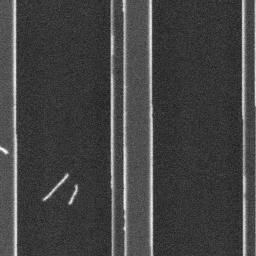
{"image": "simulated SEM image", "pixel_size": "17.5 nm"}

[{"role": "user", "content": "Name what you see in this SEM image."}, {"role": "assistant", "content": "lines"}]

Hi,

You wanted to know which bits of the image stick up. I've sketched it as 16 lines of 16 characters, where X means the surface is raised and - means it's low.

X------XX------X
X------XX------X
X------XX------X
X------XX------X
X------XX------X
X------XX------X
X------XX------X
X------XX------X
X------XX------X
X------XX------X
X------XX------X
X------XX------X
X------XX------X
X------XX------X
X------XX------X
X------XX------X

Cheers